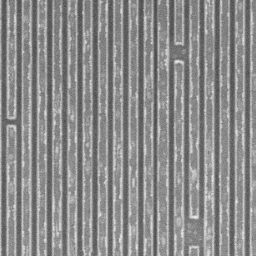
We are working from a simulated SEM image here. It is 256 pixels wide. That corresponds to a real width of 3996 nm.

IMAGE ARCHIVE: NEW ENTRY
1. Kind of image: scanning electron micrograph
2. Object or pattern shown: parallel lines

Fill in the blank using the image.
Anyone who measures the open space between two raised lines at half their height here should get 102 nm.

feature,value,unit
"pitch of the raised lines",0.238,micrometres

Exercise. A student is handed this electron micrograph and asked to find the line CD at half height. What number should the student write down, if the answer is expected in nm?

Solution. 144